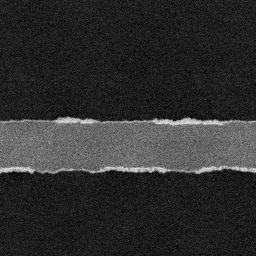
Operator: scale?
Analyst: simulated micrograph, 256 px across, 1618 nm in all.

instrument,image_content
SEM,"one or a few lines or trenches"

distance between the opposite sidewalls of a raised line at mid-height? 0.319 micrometres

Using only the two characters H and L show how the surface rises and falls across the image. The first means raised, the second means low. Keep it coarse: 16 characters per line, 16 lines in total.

LLLLLLLLLLLLLLLL
LLLLLLLLLLLLLLLL
LLLLLLLLLLLLLLLL
LLLLLLLLLLLLLLLL
LLLLLLLLLLLLLLLL
LLLLLLLLLLLLLLLL
LLLLLLLLLLLLLLLL
LLLHHHLLLHHHLLLL
HHHHHHHHHHHHHHHH
HHHHHHHHHHHHHHHH
HHHHHHHHHHHHHHHH
LLLLLLLLLLLLLLLL
LLLLLLLLLLLLLLLL
LLLLLLLLLLLLLLLL
LLLLLLLLLLLLLLLL
LLLLLLLLLLLLLLLL